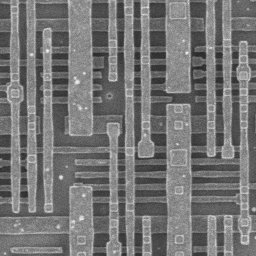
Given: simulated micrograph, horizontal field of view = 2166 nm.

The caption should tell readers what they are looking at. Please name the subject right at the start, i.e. wiring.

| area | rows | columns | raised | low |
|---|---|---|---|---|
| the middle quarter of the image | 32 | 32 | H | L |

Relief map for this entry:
LHHHHHHLLLLHHLLHHLLHHLLLLLHHHHHH
LHHHHHHLLLLHHLLHHLLHHHLLLLHHHHHL
LHHHHHHLLLLHHLLHHLLHHHLLLLHHHHHL
LHHHHHHLLLLHHLLHHLLHHHLLLLHHHHHL
LHHHHHHLLLLLLLLHHLLHHHLLLLHHHHHH
LHHHHHHLLLLLLLLHHLLHHHLLLLHHHHHH
LHHHHHHLLLLLLLLHHLLHHHLLLLHHHHHH
LHHHHHHLLLLLLLLHHLLHHHLLLLLLLLLL
LHHHHHHLLLLLLLLHHLLHHHLLLLLLLLLL
LHHHHHHLLLLLLLLHHLLHHHLLLLLLLLLL
LHHHHHHLLLLLLLLHHLLHHHLLLLHHHHHH
LHHHHHHLLLLLLLLHHLLHHHLLLLHHHHHH
LHHHHHHLLLLLLLLHHLLHHHLLLLHHHHHH
LHHHHHHLLLLLLLLHHLLHHLLLLLHHHHHH
LHHHHHHLLLLLLLLHHLLHHLLLLLHHHHHH
LHHHHHHLLLLHHHLHHLLHHLLLLLHHHHHH
LHHHHHHLLLLHHHLHHLLHHLLLLLHHHHHH
LHHHHHHLLLLHHHLHHLLHHHLLLLHHHHHH
LLLLLLLLLLLHHLLHHHLHHHLLLLHHHHHH
LLLLLLLLLLLHHLLHHHLHHHLLLLHHHHHH
LLLLLLLLLLLHHLLHHHLHHHLLLLHHHHHH
LLLLLLLLLLLHHLLHHHLHHHLLLLHHHHHH
LLLLLLLLLLLLHLLHHHLHHHLLLLHHHHHH
LLLLLLLLLLLHHLLHHHLLLLLLLLHHHHHH
LLLLLLLLLLLHHLLHHHLLLLLLLLHHHHHH
LLLLLLLLLLLHHLLHHHLLLLLLLLHHHHHH
LLLLLLLLLLLHHLLHHHLLLLLLLLHHHHHH
LLLLLLLLLLLHHLLHHHLLLLLLLLHHHHHH
LLLLLLLLLLLHHLLHHHLLLLLLLLHHHHHH
LLLLLLLLLLLHHLLHHHLLLLLLLLHHHHHH
LLLLLLLLLLLHHLLHHHLLLLLLLLHHHHHH
LHHHHHHLLLLHHLLHHHLLLLLLLLHHHHHH